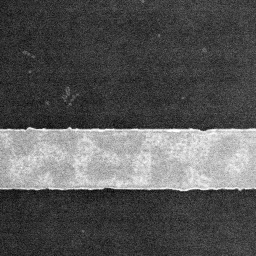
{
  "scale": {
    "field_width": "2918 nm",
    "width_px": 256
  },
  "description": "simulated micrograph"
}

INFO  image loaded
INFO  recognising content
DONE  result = one or a few lines or trenches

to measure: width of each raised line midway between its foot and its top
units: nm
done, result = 672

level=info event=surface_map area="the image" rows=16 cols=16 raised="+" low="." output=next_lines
................
................
................
................
................
................
................
................
++++++++++++++++
++++++++++++++++
++++++++++++++++
++++++++++++++++
................
................
................
................